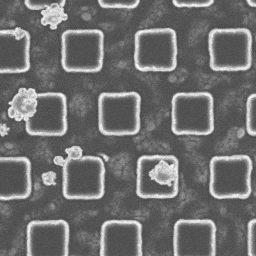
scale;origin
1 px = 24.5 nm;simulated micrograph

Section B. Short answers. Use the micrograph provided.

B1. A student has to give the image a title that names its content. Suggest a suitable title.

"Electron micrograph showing a regular array of raised bodies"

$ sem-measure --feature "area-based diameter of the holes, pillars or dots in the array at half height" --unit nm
1070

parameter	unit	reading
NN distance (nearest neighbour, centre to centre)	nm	1790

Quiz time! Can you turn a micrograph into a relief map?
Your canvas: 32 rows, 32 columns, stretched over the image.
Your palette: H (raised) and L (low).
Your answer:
LLLLHHHHLLLLLHHHHLLLLLHHHHLLLLLH
LLLLLHHHLLLLLLLLLLLLLLLLLLLLLLLL
LLLLLHHHLLLLLLLLLLLLLLLLLLLLLLLL
LLLLLLLLLLLLLLLLLLLLLLLLLLLLLLLL
HHHLLLLLHHHHHLLLLHHHHHLLLLHHHHHL
HHHHLLLLHHHHHLLLLHHHHHLLLLHHHHHL
HHHLLLLLHHHHHLLLLHHHHHLLLLHHHHHL
HHHHLLLLHHHHHLLLLHHHHHLLLLLHHHHL
HHHLLLLLHHHHLLLLLHHHHHLLLLLHHHLL
LLLLLLLLLLLLLLLLLLLLLLLLLLLLLLLL
LLLLLLLLLLLLLLLLLLLLLLLLLLLLLLLL
LLHHLLLLLLLLLLLLLLLLLLLLLLLLLLLL
LLHHHHHHLLLLLHHHHLLLLLHHHHLLLLLH
LHHHHHHHLLLLLHHHHLLLLLHHHHLLLLLH
LHHHHHHHLLLLLHHHHLLLLLHHHHLLLLLH
LLLHHHHHLLLLLHHHHLLLLLHHHHLLLLLH
LLLLHHHHLLLLLHHHHLLLLLHHHHLLLLLH
LLLLLLLLLLLLLLLLLLLLLLLLLLLLLLLL
LLLLLLLLLHLLLLLLLLLLLLLLLLLLLLLL
LLLLLLLLHHLLLLLLLLLLLLLLLLLLLLLL
HHHHLLLHHHHHHLLLLHHHHHLLLLLHHHHL
HHHHLLLLHHHHHLLLLHHHHHLLLLLHHHHL
HHHHLLLLHHHHHLLLLHHHHHLLLLHHHHHL
HHHHLLLLHHHHHLLLLHHHHHLLLLHHHHHL
HHHLLLLLHHHHLLLLLLHHHHLLLLLHHHHL
LLLLLLLLLLLLLLLLLLLLLLLLLLLLLLLL
LLLLLLLLLLLLLLLLLLLLLLLLLLLLLLLL
LLLLLLLLLLLLLLLLLLLLLLLLLLLLLLLL
LLLLHHHHLLLLLHHHHLLLLLHHHHHLLLLH
LLLLHHHHLLLLLHHHHHLLLLHHHHHLLLLH
LLLLHHHHLLLLLHHHHHLLLLHHHHHLLLLH
LLLLHHHHLLLLLHHHHHLLLLHHHHHLLLLH